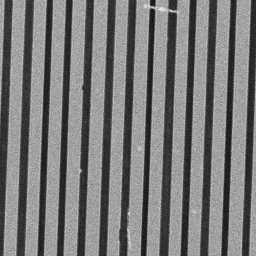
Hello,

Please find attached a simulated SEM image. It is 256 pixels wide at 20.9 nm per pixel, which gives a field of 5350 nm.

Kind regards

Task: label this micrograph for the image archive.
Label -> parallel lines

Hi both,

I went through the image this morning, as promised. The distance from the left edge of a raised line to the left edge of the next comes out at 0.427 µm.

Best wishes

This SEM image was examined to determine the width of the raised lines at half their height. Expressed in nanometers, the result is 287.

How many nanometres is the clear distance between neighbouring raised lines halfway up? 144